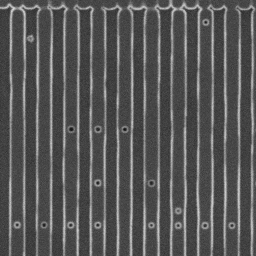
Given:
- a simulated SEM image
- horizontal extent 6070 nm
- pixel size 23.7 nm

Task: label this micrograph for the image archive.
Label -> wiring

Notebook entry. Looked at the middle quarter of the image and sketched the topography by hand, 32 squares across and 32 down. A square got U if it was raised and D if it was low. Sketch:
UUUUDDDUUUDDDDUUUDDDUUUUDDDUUUDD
UUUUDDDUUUDDDDUUUDDDUUUUDDDUUUDD
UUUUDDDUUUDDDDUUUDDDUUUUDDDUUUDD
UUUUDDDUUUDDDDUUUDDDUUUUDDDUUUDD
UUUUDDDUUUDDDDUUUDDDUUUUDDDUUUDD
UUUUDDDUUUDDDDUUUDDDUUUUDDDUUUDD
UUUUDDDUUUDDDDUUUDDDUUUUDDDUUUDD
UUUUDDDUUUDDDDUUUDDDUUUUDDDUUUDD
UUUUDDDUUUDDDDUUUDDDUUUUDDDUUUDD
UUUUDDDUUUDDDUUUUDDDUUUUDDDUUUDD
UUUUDDDUUUDDDUUUUDDDUUUUDDDUUUDD
UUUUDDDUUUDDDUUUUDDDUUUUDDDUUUDD
UUUUDDDUUUDDDUUUUDDDUUUUDDDUUUDD
UUUUDDDUUUDDDUUUUDDDUUUUDDDUUUDD
UUUDDDDUUUDDDUUUUDDDUUUUDDDUUUDD
UUUDDDDUUUDDDUUUUDDDUUUUDDDUUUDD
UDUDDDDUDUDDDUUDUDDDUUUUDDDUUUDD
UUUDDDDUUUDDDDUUUDDDUUUUDDDUUUDD
UUUDDDDUUUDDDDUUUDDDUUUUDDDUUUDD
UUUDDDDUUUDDDDUUUDDDUUUUDDDUUUDD
UUUDDDDUUUDDDDUUUDDDUUUUDDDUUUDD
UUUUDDDUUUDDDDUUUDDDUUUUDDDUUUDD
UUUUDDDUUUDDDDUUUDDDUUUUDDDUUUDD
UUUUDDDUUUDDDDUUUDDDUUUUDDDUUUDD
UUUUDDDUUUDDDDUUUDDDUUUUDDDUUUDD
UUUUDDDUUUDDDDUUUDDDUUUUDDDUUUDD
UUUUDDDUUUDDDDUUUDDDUUUUDDDUUUDD
UUUUDDDUUUDDDDUUUDDDUUUUDDDUUUDD
UUUUDDDUUUDDDDUUUDDDUUUUDDDUUUDD
UUUUDDDUDUDDDDUUUDDDUDUUDDDUUUDD
UUUUDDDUUUDDDDUUUDDDUUUUDDDUUUDD
UUUDDDDUUUDDDDUUUDDDUUUUDDDUUUDD